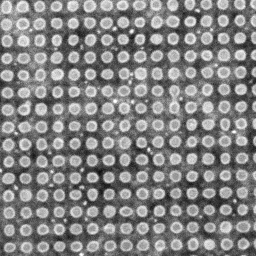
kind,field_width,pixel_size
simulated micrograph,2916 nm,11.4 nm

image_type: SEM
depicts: a regular array of raised bodies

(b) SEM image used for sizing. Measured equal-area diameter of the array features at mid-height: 114 nanometers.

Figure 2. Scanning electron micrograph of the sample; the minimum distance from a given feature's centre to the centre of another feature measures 0.188 um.